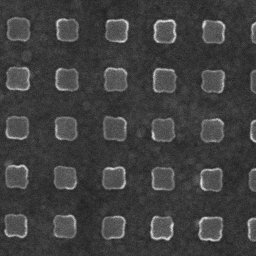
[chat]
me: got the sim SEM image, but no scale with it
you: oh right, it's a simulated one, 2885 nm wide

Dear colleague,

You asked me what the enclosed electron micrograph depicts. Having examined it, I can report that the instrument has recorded a regular array of raised bodies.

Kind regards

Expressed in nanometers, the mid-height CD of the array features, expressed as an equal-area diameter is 273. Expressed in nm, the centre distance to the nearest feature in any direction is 547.